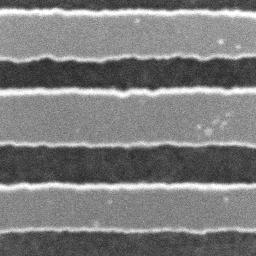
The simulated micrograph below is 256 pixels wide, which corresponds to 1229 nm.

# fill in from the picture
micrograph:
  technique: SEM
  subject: lines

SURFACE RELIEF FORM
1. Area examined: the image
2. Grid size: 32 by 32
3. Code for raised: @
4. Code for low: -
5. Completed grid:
--------------------------------
@@@@@@@@@@@@@@@@@@@@@@@@@@@@@@--
@@@@@@@@@@@@@@@@@@@@@@@@@@@@@@@@
@@@@@@@@@@@@@@@@@@@@@@@@@@@@@@@@
@@@@@@@@@@@@@@@@@@@@@@@@@@@@@@@@
@@@@@@@@@@@@@@@@@@@@@@@@@@@@@@@@
@@@@@@@@@@@@@@@@@@@@@@@@@@@@@@@@
-@@@---@--@@@-------------------
--------------------------------
--------------------------------
--------------------------------
@@@@@@@@@@@@@@@-@@@@@@@@@@@@@@@@
@@@@@@@@@@@@@@@@@@@@@@@@@@@@@@@@
@@@@@@@@@@@@@@@@@@@@@@@@@@@@@@@@
@@@@@@@@@@@@@@@@@@@@@@@@@@@@@@@@
@@@@@@@@@@@@@@@@@@@@@@@@@@@@@@@@
@@@@@@@@@@@@@@@@@@@@@@@@@@@@@@@@
@@@@@@@@@@@@@@@@@@@@@@@@@@@@@@@@
--------------------------------
--------------------------------
--------------------------------
--------------------------------
--------------------------------
@@@@@@@@@@@@@@@@@@@@@@@@@@@@@@@@
@@@@@@@@@@@@@@@@@@@@@@@@@@@@@@@@
@@@@@@@@@@@@@@@@@@@@@@@@@@@@@@@@
@@@@@@@@@@@@@@@@@@@@@@@@@@@@@@@@
@@@@@@@@@@@@@@@@@@@@@@@@@@@@@@@@
@@@@@@@@@@@@@@@@@@@@@@@@@@@@@@@@
--------------------------------
--------------------------------
--------------------------------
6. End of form